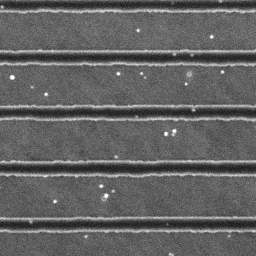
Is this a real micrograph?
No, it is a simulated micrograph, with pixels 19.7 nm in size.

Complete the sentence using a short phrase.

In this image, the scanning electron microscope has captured lines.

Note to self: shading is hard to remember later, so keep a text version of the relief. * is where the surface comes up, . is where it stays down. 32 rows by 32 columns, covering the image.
********************************
..**.....**...................*.
................................
................................
................................
................................
********************************
********************************
................................
................................
................................
................................
................................
********************************
********************************
................................
................................
................................
................................
................................
********************************
********************************
................................
................................
................................
................................
................................
********************************
********************************
................................
................................
................................